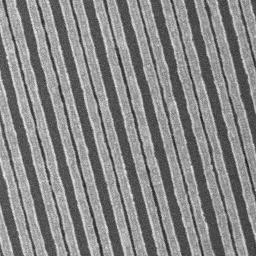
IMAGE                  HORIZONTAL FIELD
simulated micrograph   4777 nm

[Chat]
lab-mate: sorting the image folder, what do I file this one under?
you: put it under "parallel lines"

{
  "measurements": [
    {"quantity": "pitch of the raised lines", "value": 303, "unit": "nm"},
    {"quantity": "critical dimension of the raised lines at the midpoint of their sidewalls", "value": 147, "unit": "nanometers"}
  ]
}